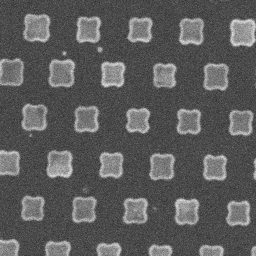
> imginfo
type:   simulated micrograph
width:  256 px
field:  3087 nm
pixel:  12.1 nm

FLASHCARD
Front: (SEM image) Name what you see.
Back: a regular array of raised bodies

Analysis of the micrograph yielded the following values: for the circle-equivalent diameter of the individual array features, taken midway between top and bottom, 290 nanometers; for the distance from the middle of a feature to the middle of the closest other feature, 619 nm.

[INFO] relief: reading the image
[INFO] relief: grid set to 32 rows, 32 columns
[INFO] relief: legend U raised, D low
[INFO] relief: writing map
DDDDDDDDDDDDDDDDDDDDDDDDDDDDDDDD
DDDDDDDDDDDDDDDDDDDDDDDDDDDDDDDD
DDDUUUDDDDUUDDDDDUDDDDDDDDDDDDDD
DDDUUUDDDDUUDDDDUUUDDDDUUDDDDUUU
DDDUUUDDDDUUDDDDUUUDDDDUUDDDDUUU
DDDDDDDDDDDDDDDDDDDDDDDDDDDDDUUD
DDDDDDDDDDDDDDDDDDDDDDDDDDDDDDDD
DDDDDDDDDDDDDDDDDDDDDDDDDDDDDDDD
UUUDDDUUUDDDDUUDDDDUUUDDDDUUDDDD
UUUDDDUUUDDDDUUDDDDUUUDDDDUUDDDD
UUDDDDUUUDDDDUUDDDDUUUDDDDUUDDDD
DDDDDDDDDDDDDDDDDDDDDDDDDDDDDDDD
DDDDDDDDDDDDDDDDDDDDDDDDDDDDDDDD
DDDUUUDDDDDUDDDDDDDDDDDDDDDDDDDD
DDDUUUDDDDUUDDDDUUUDDDUUUDDDDUUD
DDDUUUDDDDUUDDDDUUDDDDUUUDDDDUUD
DDDDDDDDDDDDDDDDDDDDDDDUUDDDDUUD
DDDDDDDDDDDDDDDDDDDDDDDDDDDDDDDD
DDDDDDDDDDDDDDDDDDDDDDDDDDDDDDDD
UUDDDDUUUDDDDUUDDDDUDDDDDDDDDDDD
UUDDDDUUUDDDDUUDDDDUUUDDDDUUDDDD
UUDDDDUUUDDDDUUDDDDUUUDDDDUUDDDD
DDDDDDDDDDDDDDDDDDDDDDDDDDDDDDDD
DDDDDDDDDDDDDDDDDDDDDDDDDDDDDDDD
DDDDDDDDDDDDDDDDDDDDDDDDDDDDDDDD
DDDUUDDDDUUUDDDDUUDDDDUUUDDDDUUD
DDDUUDDDDUUUDDDDUUDDDDUUUDDDDUUD
DDDDDDDDDDUDDDDDUUDDDDUUUDDDUUUD
DDDDDDDDDDDDDDDDDDDDDDDDDDDDDDDD
DDDDDDDDDDDDDDDDDDDDDDDDDDDDDDDD
UUDDDDUUDDDDDDDDDDDDDDDDDDDDDDDD
UUDDDDUUUDDDUUUDDDDUUDDDDUUUDDDD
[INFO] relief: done